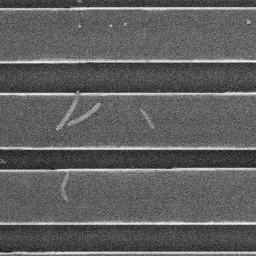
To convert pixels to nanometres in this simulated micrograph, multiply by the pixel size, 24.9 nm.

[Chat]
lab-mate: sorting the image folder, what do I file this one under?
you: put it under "lines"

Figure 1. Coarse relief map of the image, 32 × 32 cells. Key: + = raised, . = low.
................................
++++++++++++++++++++++++++++++++
++++++++++++++++++++++++++++++++
++++++++++++++++++++++++++++++++
++++++++++++++++++++++++++++++++
++++++++++++++++++++++++++++++++
++++++++++++++++++++++++++++++++
++++++++++++++++++++++++++++++++
................................
................................
................................
................................
++++++++++++++++++++++++++++++++
++++++++++++++++++++++++++++++++
++++++++++++++++++++++++++++++++
++++++++++++++++++++++++++++++++
++++++++++++++++++++++++++++++++
++++++++++++++++++++++++++++++++
++++++++++++++++++++++++++++++++
................................
................................
++++++++++++++++++++++++++++++++
++++++++++++++++++++++++++++++++
++++++++++++++++++++++++++++++++
++++++++++++++++++++++++++++++++
++++++++++++++++++++++++++++++++
++++++++++++++++++++++++++++++++
++++++++++++++++++++++++++++++++
................................
................................
................................
................................